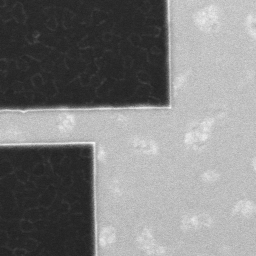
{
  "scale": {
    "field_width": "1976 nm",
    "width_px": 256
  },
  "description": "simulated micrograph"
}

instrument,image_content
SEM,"one or a few lines or trenches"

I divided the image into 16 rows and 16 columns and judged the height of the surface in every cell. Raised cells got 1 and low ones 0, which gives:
1111111111100000
1111111111100000
1111111111100000
1111111111100000
1111111111100000
1111111111100000
1111111111100000
0000000000000000
0000000000000000
1111110000000000
1111110000000000
1111110000000000
1111110000000000
1111110000000000
1111110000000000
1111110000000000